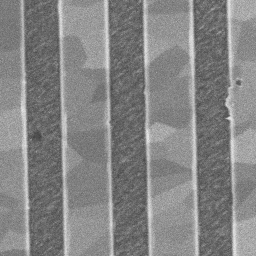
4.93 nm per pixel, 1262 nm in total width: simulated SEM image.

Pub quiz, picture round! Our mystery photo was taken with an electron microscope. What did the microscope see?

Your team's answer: one or a few lines or trenches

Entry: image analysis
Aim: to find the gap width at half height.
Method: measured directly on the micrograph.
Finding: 185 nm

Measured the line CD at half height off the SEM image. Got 0.234 micrometres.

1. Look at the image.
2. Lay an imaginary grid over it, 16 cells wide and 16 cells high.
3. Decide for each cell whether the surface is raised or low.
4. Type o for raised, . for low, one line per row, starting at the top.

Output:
o...ooo..ooo..oo
o...ooo..ooo..oo
o...ooo..ooo..oo
o...ooo..ooo..oo
oo..ooo..ooo..oo
oo..ooo..ooo..oo
oo..ooo..ooo..oo
oo..ooo..ooo..oo
oo..ooo..ooo...o
oo..ooo..ooo...o
oo..ooo..ooo...o
oo..ooo..ooo...o
oo..ooo..ooo...o
oo..ooo..ooo...o
oo..ooo..ooo...o
oo..ooo..ooo...o